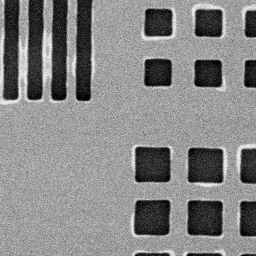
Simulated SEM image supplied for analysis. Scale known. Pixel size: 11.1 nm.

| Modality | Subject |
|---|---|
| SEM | groups of lines, slits or small figures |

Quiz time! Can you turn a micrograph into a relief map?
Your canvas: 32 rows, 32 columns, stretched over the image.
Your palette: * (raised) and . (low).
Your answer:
.........*..********************
..*..**.....******....**....***.
..*..*......******....**....**..
..*.........******....**....**..
..*.........******...****...***.
..*.........********************
.....*......********************
............******...****..****.
............******....**....**..
..*.....*...******....**....**..
..*..*..*..*******...***....**..
..*..*..*..*********************
..**.**.**.*********************
********************************
********************************
********************************
********************************
********************************
*****************....***...***..
*****************....**.....**..
*****************....**.....**..
*****************....**.....**..
*****************....**.....**..
********************************
********************************
*****************....**.....**..
*****************....**.....**..
*****************....**.....**..
*****************....**.....**..
*****************...****...***..
********************************
*****************....******.****